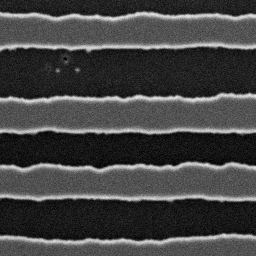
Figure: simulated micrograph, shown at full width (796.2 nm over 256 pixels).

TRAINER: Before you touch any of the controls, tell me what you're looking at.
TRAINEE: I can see lines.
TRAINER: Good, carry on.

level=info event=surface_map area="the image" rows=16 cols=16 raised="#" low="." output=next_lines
................
################
################
................
................
................
################
################
................
................
################
################
..#...........##
................
................
################